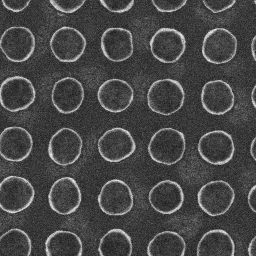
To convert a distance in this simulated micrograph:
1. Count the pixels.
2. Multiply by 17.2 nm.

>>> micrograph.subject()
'a regular array of raised bodies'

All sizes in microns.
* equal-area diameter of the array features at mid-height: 0.591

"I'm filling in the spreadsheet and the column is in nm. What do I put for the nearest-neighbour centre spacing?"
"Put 858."